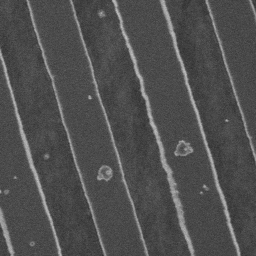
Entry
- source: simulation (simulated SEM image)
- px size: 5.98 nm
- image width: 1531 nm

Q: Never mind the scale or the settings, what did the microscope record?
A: lines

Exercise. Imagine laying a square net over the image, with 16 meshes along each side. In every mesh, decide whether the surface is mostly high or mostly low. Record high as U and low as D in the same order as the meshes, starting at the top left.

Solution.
DDUUUDDUUUDDDUUU
DDUUUDDDUUUDDUUU
DDUUUDDDUUUDDDUU
DDDUUUDDUUUDDDUU
DDDUUUDDDUUUDDUU
UDDUUUDDDUUUDDDU
UDDDUUDDDUUUDDDU
UDDDUUUDDUUUUDDU
UUDDUUUDDDUUUDDU
UUDDDUUDDDUUUDDD
UUDDDUUUDDUUUDDD
UUDDDUUUDDDUUUDD
UUUDDUUUDDDUUUDD
UUUDDDUUUDDUUUDD
UUUDDDUUUDDDUUUD
DUUUDDUUUDDDUUUD